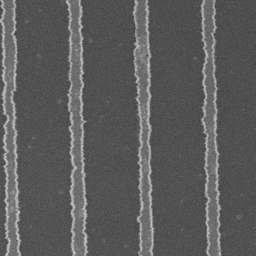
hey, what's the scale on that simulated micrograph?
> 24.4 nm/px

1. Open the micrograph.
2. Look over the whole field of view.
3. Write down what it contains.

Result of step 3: one or a few lines or trenches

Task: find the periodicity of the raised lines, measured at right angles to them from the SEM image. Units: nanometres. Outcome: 1630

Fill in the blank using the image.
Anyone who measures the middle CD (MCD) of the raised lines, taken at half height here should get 278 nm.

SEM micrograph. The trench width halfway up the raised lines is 1360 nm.